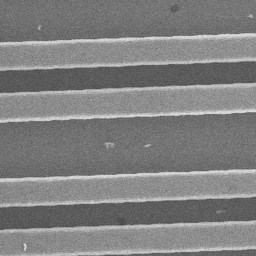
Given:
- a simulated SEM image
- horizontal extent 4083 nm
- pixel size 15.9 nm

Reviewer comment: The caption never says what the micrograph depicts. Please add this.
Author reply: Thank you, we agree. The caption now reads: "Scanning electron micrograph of lines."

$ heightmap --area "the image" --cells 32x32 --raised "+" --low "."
................................
................................
................................
................................
.........................+++++++
++++++++++++++++++++++++++++++++
++++++++++++++++++++++++++++++++
++++++++++++++++++++++++++++++++
+++++++.........................
................................
.............................+++
.....+++++++++++++++++++++++++++
++++++++++++++++++++++++++++++++
++++++++++++++++++++++++++++++++
+++++++++++++++++...............
................................
................................
................................
................................
................................
................................
........................++++++++
++++++++++++++++++++++++++++++++
++++++++++++++++++++++++++++++++
++++++++++++++++++++++++++++++++
++++++++++......................
................................
................................
.......+++++++++++++++++++++++++
++++++++++++++++++++++++++++++++
++++++++++++++++++++++++++++++++
++++++++++++++++++++++..........